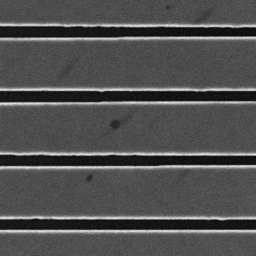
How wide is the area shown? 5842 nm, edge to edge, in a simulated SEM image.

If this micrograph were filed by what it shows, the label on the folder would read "lines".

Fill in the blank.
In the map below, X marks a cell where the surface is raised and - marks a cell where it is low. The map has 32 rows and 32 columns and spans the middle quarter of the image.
XXXXXXXXXXXXXXXXXXXXXXXXXXXXXXXX
XXXXXXXXXXXXXXXXXXXXXXXXXXXXXXXX
XXXXXXXXXXXXXXXXXXXXXXXXXXXXXXXX
XXXXXXXXXXXXXXXXXXXXXXXXXXXXXXXX
XXXXXXXXXXXXXXXXXXXXXXXXXXXXXXXX
XXXXXXXXXXXXXXXXXXXXXXXXXXXXXXXX
XXXXXXXXXXXXXXXXXXXXXXXXXXXXXXXX
--------------------------------
--------------------------------
--------------------------------
XXXXXXXXXXXXXXXXXXXXXXXXXXXXXXXX
XXXXXXXXXXXXXXXXXXXXXXXXXXXXXXXX
XXXXXXXXXXXXXXXXXXXXXXXXXXXXXXXX
XXXXXXXXXXXXXXXXXXXXXXXXXXXXXXXX
XXXXXXXXXXXXXXXXXXXXXXXXXXXXXXXX
XXXXXXXXXXXXXXXXXXXXXXXXXXXXXXXX
XXXXXXXXXXXXXXXXXXXXXXXXXXXXXXXX
XXXXXXXXXXXXXXXXXXXXXXXXXXXXXXXX
XXXXXXXXXXXXXXXXXXXXXXXXXXXXXXXX
XXXXXXXXXXXXXXXXXXXXXXXXXXXXXXXX
XXXXXXXXXXXXXXXXXXXXXXXXXXXXXXXX
XXXXXXXXXXXXXXXXXXXXXXXXXXXXXXXX
XXXXXXXXXXXXXXXXXXXXXXXXXXXXXXXX
--------------------------------
--------------------------------
-------------------------XXXXXXX
XXXXXXXXXXXXXXXXXXXXXXXXXXXXXXXX
XXXXXXXXXXXXXXXXXXXXXXXXXXXXXXXX
XXXXXXXXXXXXXXXXXXXXXXXXXXXXXXXX
XXXXXXXXXXXXXXXXXXXXXXXXXXXXXXXX
XXXXXXXXXXXXXXXXXXXXXXXXXXXXXXXX
XXXXXXXXXXXXXXXXXXXXXXXXXXXXXXXX